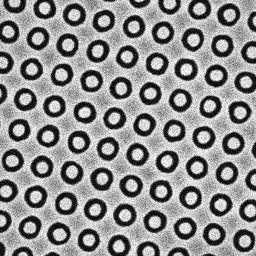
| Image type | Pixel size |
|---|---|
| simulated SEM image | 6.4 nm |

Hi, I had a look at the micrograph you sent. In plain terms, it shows a regular array of ring-shaped grooves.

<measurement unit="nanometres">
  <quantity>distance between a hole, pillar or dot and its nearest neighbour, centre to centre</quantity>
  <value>191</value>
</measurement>